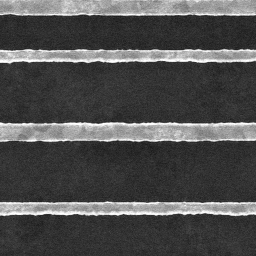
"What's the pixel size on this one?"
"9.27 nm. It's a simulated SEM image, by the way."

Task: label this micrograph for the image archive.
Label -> lines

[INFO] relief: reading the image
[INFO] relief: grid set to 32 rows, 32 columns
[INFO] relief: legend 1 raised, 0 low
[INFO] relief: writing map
11111111111111111111111111111111
11111111111111111111111111111111
00000000000000000000000000000000
00000000000000000000000000000000
00000000000000000000000000000000
00000000000000000000000000000000
11111111111111111111111111111111
11111111111111111111111111111111
00000000000000000000000000000000
00000000000000000000000000000000
00000000000000000000000000000000
00000000000000000000000000000000
00000000000000000000000000000000
00000000000000000000000000000000
00000000000000000000000000000000
11100010111001110111111000011111
11111111111111111111111111111111
10011111000001001111011110100000
00000000000000000000000000000000
00000000000000000000000000000000
00000000000000000000000000000000
00000000000000000000000000000000
00000000000000000000000000000000
00000000000000000000000000000000
00000000000000000000000000000000
11111111111111111111111111111111
11111111111111111111111111111111
00000000000000000000000000000000
00000000000000000000000000000000
00000000000000000000000000000000
00000000000000000000000000000000
00000000000000000000000000000000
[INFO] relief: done